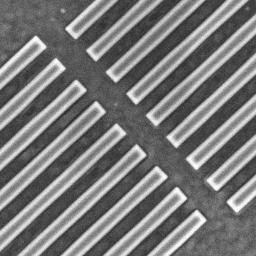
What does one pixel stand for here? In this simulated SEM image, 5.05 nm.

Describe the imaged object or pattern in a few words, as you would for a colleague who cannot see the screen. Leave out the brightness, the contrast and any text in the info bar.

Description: groups of lines, slits or small figures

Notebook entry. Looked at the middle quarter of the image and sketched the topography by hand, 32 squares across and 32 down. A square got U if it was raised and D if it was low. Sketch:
DDDDDDDDDDDDUUUUUDDDDDDUUUUUDDDD
DDDDDDDDDDDUUUUUDDDDDDUUUUUDDDDD
DDDDDDDDDDDUUUUDDDDDDUUUUUDDDDDD
DDDDDDDDDDDDUUDDDDDDUUUUUDDDDDDU
DDDDDDDDDDDDDDDDDDDUUUUUDDDDDDUU
DDUUDDDDDDDDDDDDDDUUUUUDDDDDDUUU
DUUUUDDDDDDDDDDDDUUUUUDDDDDDUUUU
UUUUDDDDDDDDDDDDUUUUDDDDDDDUUUUD
UUUDDDDDDDDDDDDDDUUDDDDDDDUUUUDD
UUDDDDDDDDDDDDDDDDDDDDDDUUUUUDDD
UDDDDDDUUDDDDDDDDDDDDDDUUUUUDDDD
DDDDDDUUUUDDDDDDDDDDDDUUUUUDDDDD
DDDDDUUUUUDDDDDDDDDDDUUUUUDDDDDD
DDDDUUUUDDDDDDDDDDDDDUUUUDDDDDDU
DDDUUUUDDDDDDDDDDDDDDDUUDDDDDDUU
DDUUUUUDDDDDDDDDDDDDDDDDDDDDDUUU
DUUUUDDDDDDDUUDDDDDDDDDDDDDDUUUU
UUUUDDDDDDDUUUUDDDDDDDDDDDDUUUUD
UUUDDDDDDUUUUUDDDDDDDDDDDDUUUUDD
UUDDDDDDUUUUUDDDDDDDDDDDDDDUUDDD
UDDDDDDUUUUUDDDDDDDDDDDDDDDDDDDD
DDDDDDUUUUUDDDDDDUUDDDDDDDDDDDDD
DDDDDUUUUUDDDDDDUUUUDDDDDDDDDDDD
DDDDUUUUUDDDDDDUUUUUDDDDDDDDDDDU
DDDUUUUUDDDDDDUUUUDDDDDDDDDDDDDD
DDUUUUDDDDDDDUUUUDDDDDDDDDDDDDDD
DUUUUDDDDDDDUUUUDDDDDDDUDDDDDDDD
UUUUDDDDDDDUUUUDDDDDDUUUUDDDDDDD
UUUDDDDDDDUUUUDDDDDDUUUUUDDDDDDD
UUDDDDDDDUUUUDDDDDDUUUUUDDDDDDDD
UDDDDDDUUUUUDDDDDDUUUUUDDDDDDDDD
DDDDDDUUUUUDDDDDDUUUUUDDDDDDDDDD